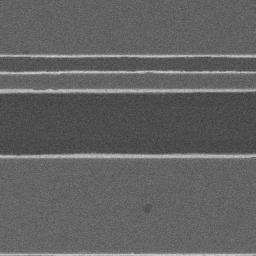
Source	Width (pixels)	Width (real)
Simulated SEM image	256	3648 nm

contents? lines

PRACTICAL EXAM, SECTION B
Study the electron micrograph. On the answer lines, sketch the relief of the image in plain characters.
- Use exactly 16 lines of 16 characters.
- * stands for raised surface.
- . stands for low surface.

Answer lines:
****************
****************
****************
****************
****************
****************
................
................
................
................
****************
****************
****************
****************
****************
****************